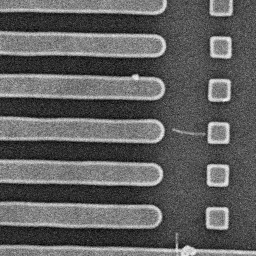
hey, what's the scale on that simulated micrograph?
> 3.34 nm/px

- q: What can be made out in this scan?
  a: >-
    groups of lines, slits or small figures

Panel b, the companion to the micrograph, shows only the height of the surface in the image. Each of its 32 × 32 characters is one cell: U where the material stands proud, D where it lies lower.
UUUUUUUUUUUUUUUUUUUUUDDDDDUUUDDD
DDDDDDDDDDDDDDDUUUUUDDDDDDUUUDDD
DDDDDDDDDDDDDDDDDDDDDDDDDDDDDDDD
DDDDDDDDDDDDDDDDDDDDDDDDDDDDDDDD
UUUUUUUUUUUUUUUUUUUDDDDDDDDDDDDD
UUUUUUUUUUUUUUUUUUUUUDDDDDUUUDDD
UUUUUUUUUUUUUUUUUUUUDDDDDDUUUDDD
DDDDDDDDDDDDDDDDDDDDDDDDDDDDDDDD
DDDDDDDDDDDDDDDDDDDDDDDDDDDDDDDD
UUUUUUUUDDDDDDDDDDDDDDDDDDDDDDDD
UUUUUUUUUUUUUUUUUUUUDDDDDDUUUDDD
UUUUUUUUUUUUUUUUUUUUDDDDDDUUUDDD
DDDDDDDDDDDDDDDDDDDDDDDDDDDUDDDD
DDDDDDDDDDDDDDDDDDDDDDDDDDDDDDDD
DDDDDDDDDDDDDDDDDDDDDDDDDDDDDDDD
UUUUUUUUUUUUUUUUUUUUDDDDDDDUDDDD
UUUUUUUUUUUUUUUUUUUUDDDDDDUUDDDD
DDDDDDDDDUUUUUUUUUUUDDDDDDUUDDDD
DDDDDDDDDDDDDDDDDDDDDDDDDDDDDDDD
DDDDDDDDDDDDDDDDDDDDDDDDDDDDDDDD
UUUUUUUUUUUUUUUUUUDDDDDDDDDDDDDD
UUUUUUUUUUUUUUUUUUUUDDDDDDUUDDDD
UUUUUUUUUUUUUUUUUUUUDDDDDDUUDDDD
DDDDDDDDDDDDDDDDDDDDDDDDDDDDDDDD
DDDDDDDDDDDDDDDDDDDDDDDDDDDDDDDD
UUUUDDDDDDDDDDDDDDDDDDDDDDDDDDDD
UUUUUUUUUUUUUUUUUUUUDDDDDDUUDDDD
UUUUUUUUUUUUUUUUUUUUDDDDDDUUDDDD
DDDDDDDDDDDDDDDDDDDDDDDDDDDUDDDD
DDDDDDDDDDDDDDDDDDDDDDDDDDDDDDDD
DDDDDDDDDDDDDDDDDDDDDDDDDDDDDDDD
UUUUUUUUUUUUUUUUUUUUUUUUUUUUUUUD